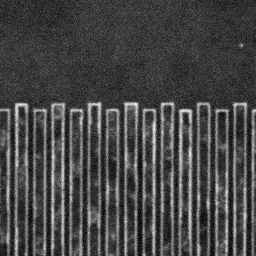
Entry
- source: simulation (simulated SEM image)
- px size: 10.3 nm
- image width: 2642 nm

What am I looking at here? parallel lines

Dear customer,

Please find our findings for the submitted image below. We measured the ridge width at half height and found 117 nm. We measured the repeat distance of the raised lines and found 188 nm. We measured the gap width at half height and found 69.7 nanometers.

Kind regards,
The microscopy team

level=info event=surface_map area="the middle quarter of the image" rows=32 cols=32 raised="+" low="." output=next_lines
................................
................................
................................
................................
................................
................................
................................
................................
................................
................................
......+++.......++.......++.....
......+++.......++.......++.....
..++..+++..++...++..+++..++..+++
..++..+++..++...++..+++..++..+++
..++..+++..++...++..+++..++..+++
..++..+++..++...++..+++..++..+++
..++..+++..++...++..+++..++..+++
..++..+++..++...++..+++..++..+++
..++..+++..++...++..+++..++..+++
..++..+++..++...++..+++..++..+++
..++..+++..++...++..+++..++..+++
..++..+++..++...++..+++..++..+++
..++..+++..++...++..+++..++..+++
..++..+++..++...++..+++..++..+++
..++..+++..++...++..+++..++..+++
..++..+++..++...++..+++..++..+++
..++..+++..++...++..+++..++..+++
..++..+++..++...++..+++..++..+++
..++..+++..++...++..+++..++..+++
..++..+++..++...++..+++..++..+++
..++..+++..++...++..+++..++..+++
..++..+++..++...++..+++..++..+++